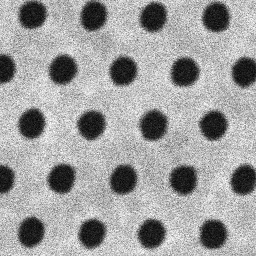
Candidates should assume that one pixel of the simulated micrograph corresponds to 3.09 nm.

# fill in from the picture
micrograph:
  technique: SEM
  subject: a regular array of holes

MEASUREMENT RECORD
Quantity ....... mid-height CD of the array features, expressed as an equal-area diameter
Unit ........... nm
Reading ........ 86.9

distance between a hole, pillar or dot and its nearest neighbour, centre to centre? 186 nm